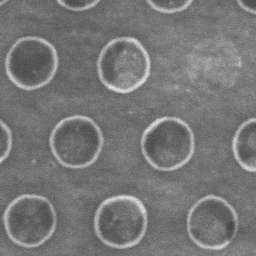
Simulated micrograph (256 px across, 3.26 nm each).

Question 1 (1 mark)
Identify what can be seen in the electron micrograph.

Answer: raised bodies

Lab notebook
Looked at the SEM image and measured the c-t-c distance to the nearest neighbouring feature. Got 0.296 um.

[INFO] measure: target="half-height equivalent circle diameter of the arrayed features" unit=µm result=0.164